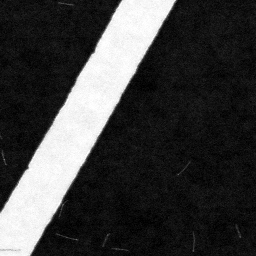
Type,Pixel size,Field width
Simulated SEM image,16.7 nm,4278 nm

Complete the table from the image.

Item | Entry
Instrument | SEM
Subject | one or a few lines or trenches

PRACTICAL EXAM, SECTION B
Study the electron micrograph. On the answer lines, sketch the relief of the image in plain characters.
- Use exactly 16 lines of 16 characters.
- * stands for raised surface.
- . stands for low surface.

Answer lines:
*******....*****
*******...******
******...*******
******...*******
*****...********
*****...********
****...*********
***....*********
***...**********
**....**********
**...***********
*...************
*...************
...*************
...*************
..**************